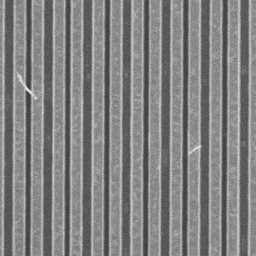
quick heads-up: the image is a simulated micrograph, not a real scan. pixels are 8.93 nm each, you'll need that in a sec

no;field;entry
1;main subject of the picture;parallel lines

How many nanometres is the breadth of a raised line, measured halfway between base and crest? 108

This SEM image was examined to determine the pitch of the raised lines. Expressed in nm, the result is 174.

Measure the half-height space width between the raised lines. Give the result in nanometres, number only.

83.7